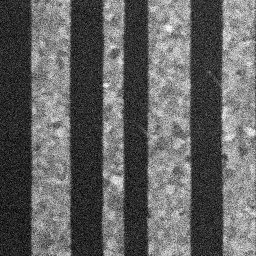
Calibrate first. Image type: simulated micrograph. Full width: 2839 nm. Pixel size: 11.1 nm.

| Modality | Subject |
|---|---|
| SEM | one or a few lines or trenches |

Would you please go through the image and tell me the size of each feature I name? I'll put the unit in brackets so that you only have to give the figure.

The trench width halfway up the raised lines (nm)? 365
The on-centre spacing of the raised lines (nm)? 686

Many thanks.